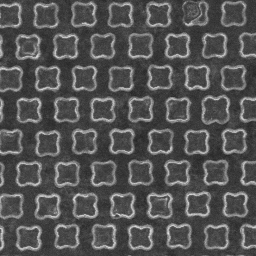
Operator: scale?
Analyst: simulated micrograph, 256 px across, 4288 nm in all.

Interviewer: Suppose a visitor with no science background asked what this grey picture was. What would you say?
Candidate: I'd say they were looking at a regular array of raised bodies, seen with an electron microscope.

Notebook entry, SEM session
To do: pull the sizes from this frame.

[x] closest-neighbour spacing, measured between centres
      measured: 606 nanometers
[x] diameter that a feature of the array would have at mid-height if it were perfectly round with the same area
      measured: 426 nm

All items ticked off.